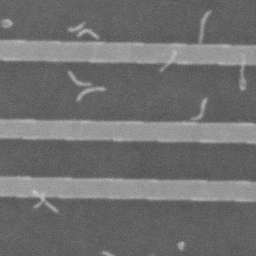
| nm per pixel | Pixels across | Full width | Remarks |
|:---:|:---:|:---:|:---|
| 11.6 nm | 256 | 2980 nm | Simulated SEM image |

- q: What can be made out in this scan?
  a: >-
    lines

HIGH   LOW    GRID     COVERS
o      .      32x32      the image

................................
................................
................................
................................
................................
oooooooooooooooooo..............
oooooooooooooooooooooooooooooooo
.....ooooooooooooooooooooooooooo
................................
................................
................................
................................
................................
................................
................................
oooooooooooooooooooooooooooooooo
oooooooooooooooooooooooooooooooo
..............oooooooooooooooooo
................................
................................
................................
................................
ooooooooooooooo.................
oooooooooooooooooooooooooooooooo
..oooooooooooooooooooooooooooooo
................................
................................
................................
................................
................................
................................
................................